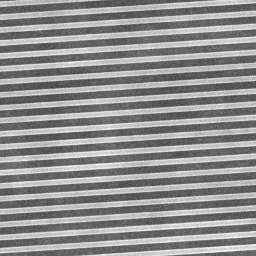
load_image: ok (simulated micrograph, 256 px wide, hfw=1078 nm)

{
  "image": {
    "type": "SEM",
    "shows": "parallel lines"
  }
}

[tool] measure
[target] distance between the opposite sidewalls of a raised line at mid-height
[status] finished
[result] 5.23 pixels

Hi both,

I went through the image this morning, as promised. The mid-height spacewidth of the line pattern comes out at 33.1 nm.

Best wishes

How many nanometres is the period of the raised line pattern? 54.5